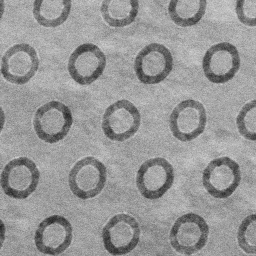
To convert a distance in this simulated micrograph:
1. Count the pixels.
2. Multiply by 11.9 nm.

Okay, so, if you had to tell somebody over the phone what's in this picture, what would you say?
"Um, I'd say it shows a regular array of ring-shaped raised bodies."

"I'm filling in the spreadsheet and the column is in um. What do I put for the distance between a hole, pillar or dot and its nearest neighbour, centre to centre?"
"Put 0.78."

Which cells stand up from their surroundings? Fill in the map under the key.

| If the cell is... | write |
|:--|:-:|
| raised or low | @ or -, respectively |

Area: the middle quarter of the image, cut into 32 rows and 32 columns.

-@@-----@@@------@@@-----@@-----
-@@-----@@-------@@@----@@@-----
-@@@---@@@--------@@@--@@@------
--@@@@@@@---------@@@@@@@@------
---@@@@@-----------@@@@@--------
--------------------------------
--------------------------------
--------------------------------
--------------------------------
-------------@@@@------------@@@
@----------@@@@@@@----------@@@@
@@--------@@@@-@@-@--------@@@--
@@--------@@----@@@--------@@---
@@-------@@@-----@@-------@@@---
@@-------@@------@@-------@@----
@@-------@@@-----@@-------@@@---
@---------@@----@@@-------@@@---
@---------@@@@@@@@---------@@@@@
-----------@@@@@------------@@@@
--------------------------------
--------------------------------
--------------------------------
--------------------------------
----@@@@--------------@@@-------
---@@@@@@@----------@@@@@@------
--@@@@@@@@---------@@@@@@@@-----
--@@----@@@-------@@@----@@-----
-@@@-----@@-------@@-----@@@----
-@@------@@-------@@-----@@-----
-@@-----@@@-------@@-----@@-----
-@@@----@@--------@@----@@@-----
-@@@@-@@@@--------@@@@-@@@------